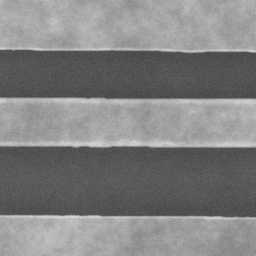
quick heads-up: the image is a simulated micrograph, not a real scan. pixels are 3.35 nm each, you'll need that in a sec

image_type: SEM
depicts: lines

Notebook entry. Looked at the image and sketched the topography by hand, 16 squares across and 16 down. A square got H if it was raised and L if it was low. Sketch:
HHHHHHHHHHHHHHHH
HHHHHHHHHHHHHHHH
HHHHHHHHHHHHHHHH
LLLLLLLLLLLLLLLL
LLLLLLLLLLLLLLLL
LLLLLLLLLLLLLLLL
HHHHHHHHHHHHHHHH
HHHHHHHHHHHHHHHH
HHHHHHHHHHHHHHHH
LLLLLLLLLLLLLLLL
LLLLLLLLLLLLLLLL
LLLLLLLLLLLLLLLL
LLLLLLLLLLLLLLLL
HHHHHHHLLLLLLLLL
HHHHHHHHHHHHHHHH
HHHHHHHHHHHHHHHH